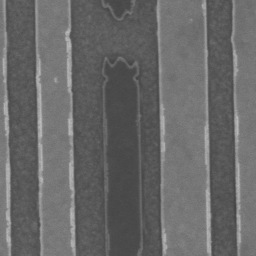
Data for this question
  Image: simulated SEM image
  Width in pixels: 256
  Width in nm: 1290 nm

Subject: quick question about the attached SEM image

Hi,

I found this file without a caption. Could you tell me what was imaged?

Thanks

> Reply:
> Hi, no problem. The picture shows one or a few lines or trenches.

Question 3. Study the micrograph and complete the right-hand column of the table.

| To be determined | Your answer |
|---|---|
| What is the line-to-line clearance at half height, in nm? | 145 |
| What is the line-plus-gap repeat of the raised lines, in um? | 0.325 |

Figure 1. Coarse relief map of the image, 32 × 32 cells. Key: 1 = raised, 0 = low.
10001111100001111000111111000111
10001111100000110000111111000111
10001111100000000000111111000111
10000111100000000000111111000111
10000111100000000000111111000111
10000111100000000000111111000111
10000111100000000000111111000111
10000111100000010000111111000111
10000111100001111000111111000111
10000111100001111000111111000111
10000111100001111000111111000111
10000111100001111000111111000111
10000111100001111000111111000111
10000111100001111000111111000111
10000111100001111000111111000111
10000111100001111000111111000111
10000111100001111000111111000111
10000111100001111000111111000111
10000111100001111000111111000011
10000111100001111000111111000011
10000111100001111000111111000011
10000111100001111000111111000011
10000111100001111100111111000111
10000111100001111100111111000011
10000111100001111100111111000011
10000111100001111100111111000011
10000111100001111100111111000011
10000111100001111100111111000011
10000111100001111100111111000011
10000111100001111100111111000011
10000111100001111100111111000011
10000111100001111100111111000011